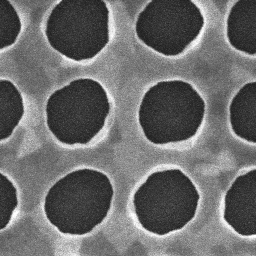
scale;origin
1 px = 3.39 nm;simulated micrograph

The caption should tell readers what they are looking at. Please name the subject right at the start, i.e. holes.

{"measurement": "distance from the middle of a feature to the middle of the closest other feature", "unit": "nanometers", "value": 295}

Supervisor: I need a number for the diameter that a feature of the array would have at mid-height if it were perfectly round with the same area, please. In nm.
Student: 224